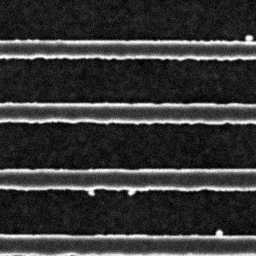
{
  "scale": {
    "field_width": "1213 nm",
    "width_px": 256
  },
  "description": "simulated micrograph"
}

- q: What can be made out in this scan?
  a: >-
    lines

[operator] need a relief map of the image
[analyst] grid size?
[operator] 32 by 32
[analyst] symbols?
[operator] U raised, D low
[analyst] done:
DDDDDDDDDDDDDDDDDDDDDDDDDDDDDDDD
DDDDDDDDDDDDDDDDDDDDDDDDDDDDDDDD
DDDDDDDDDDDDDDDDDDDDDDDDDDDDDDDD
DDDDDDDDDDDDDDDDDDDDDDDDDDDDDDDD
DDDDDDDDDDDDDDDDDDDDDDDDDDDDDDDD
UUUUUUUUUUUUUUUUUUUUUUUUUUUUUUUU
UUUUUUUUUUUUUUUUUUUUUUUUUUUUUUUU
DDDDDDDDDDDDDDDDDDDDDDDDDDDDDDDD
DDDDDDDDDDDDDDDDDDDDDDDDDDDDDDDD
DDDDDDDDDDDDDDDDDDDDDDDDDDDDDDDD
DDDDDDDDDDDDDDDDDDDDDDDDDDDDDDDD
DDDDDDDDDDDDDDDDDDDDDDDDDDDDDDDD
DDDDDDDDDDDDDDDDDDDDDDDDDDDDDDDD
UUUUUUUUUUUUUUUUUUUUUUUUUUUUUUUU
UUUUUUUUUUUUUUUUUUUUUUUUUUUUUUUU
DDDDDDDDDDDDDDDDDDDDDDDDDDDDDDDD
DDDDDDDDDDDDDDDDDDDDDDDDDDDDDDDD
DDDDDDDDDDDDDDDDDDDDDDDDDDDDDDDD
DDDDDDDDDDDDDDDDDDDDDDDDDDDDDDDD
DDDDDDDDDDDDDDDDDDDDDDDDDDDDDDDD
DDDDDDDDDDDDDDDDDDDDDDDDDDDDDDDD
UUUUUUUUUUUUUUUUUUUUUUUUUUUUUUUU
UUUUUUUUUUUUUUUUUUUUUUUUUUUUUUUU
UUUUUUUUUUUUUUUUUUUUUUUUUUUUUUUU
DDDDDDDDDDDDDDDDDDDDDDDDDDDDDDDD
DDDDDDDDDDDDDDDDDDDDDDDDDDDDDDDD
DDDDDDDDDDDDDDDDDDDDDDDDDDDDDDDD
DDDDDDDDDDDDDDDDDDDDDDDDDDDDDDDD
DDDDDDDDDDDDDDDDDDDDDDDDDDDDDDDD
UUUUUUUUDDDDUUUUUUUDDDDUUDDDDDDD
UUUUUUUUUUUUUUUUUUUUUUUUUUUUUUUU
UUUUUUUUUUUUUUUUUUUUUUUUUUUUUUUU